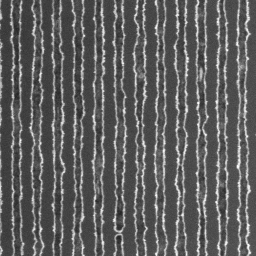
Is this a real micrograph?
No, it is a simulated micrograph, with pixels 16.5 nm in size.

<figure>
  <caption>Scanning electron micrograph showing parallel lines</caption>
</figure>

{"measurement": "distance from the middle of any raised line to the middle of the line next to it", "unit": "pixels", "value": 20.5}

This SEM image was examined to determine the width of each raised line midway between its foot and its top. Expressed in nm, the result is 227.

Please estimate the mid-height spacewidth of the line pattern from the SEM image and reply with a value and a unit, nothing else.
113 nm